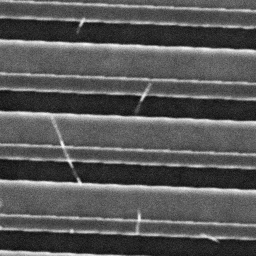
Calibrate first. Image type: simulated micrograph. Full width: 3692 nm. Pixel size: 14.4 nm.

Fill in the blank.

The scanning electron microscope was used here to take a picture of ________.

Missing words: lines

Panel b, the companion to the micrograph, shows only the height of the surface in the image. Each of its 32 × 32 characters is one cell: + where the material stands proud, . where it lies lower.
++++++++++++++++++++++++++++++++
++++++++++++++++++++++++++++++++
.........+++++++++++++++++++++++
................................
................................
+++++++++++.....................
++++++++++++++++++++++++++++++++
++++++++++++++++++++++++++++++++
++++++++++++++++++++++++++++++++
++++++++++++++++++++++++++++++++
++++++++++++++++++++++++++++++++
........++++++++++++++++++++++++
................................
................................
++++++++++++....................
++++++++++++++++++++++++++++++++
++++++++++++++++++++++++++++++++
++++++++++++++++++++++++++++++++
++++++++++++++++++++++++++++++++
++++++++++++++++++++++++++++++++
...................+++++++++++++
................................
................................
++++++++++++++++++++++++........
++++++++++++++++++++++++++++++++
++++++++++++++++++++++++++++++++
++++++++++++++++++++++++++++++++
++++++++++++++++++++++++++++++++
++++++++++++++++++++++++++++++++
......................++++++++++
................................
++++............................